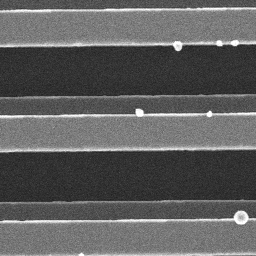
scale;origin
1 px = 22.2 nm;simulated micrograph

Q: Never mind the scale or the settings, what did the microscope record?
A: lines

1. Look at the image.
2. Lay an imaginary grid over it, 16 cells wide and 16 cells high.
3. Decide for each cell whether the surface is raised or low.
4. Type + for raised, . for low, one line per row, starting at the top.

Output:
++++++++++++++++
++++++++++++++++
++++++++++++++++
................
................
................
++++++++++++++++
++++++++++++++++
++++++++++++++++
................
................
................
................
++++++++++++++++
++++++++++++++++
++++++++++++++++